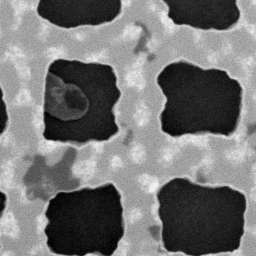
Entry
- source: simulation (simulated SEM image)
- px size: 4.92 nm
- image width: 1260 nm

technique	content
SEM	holes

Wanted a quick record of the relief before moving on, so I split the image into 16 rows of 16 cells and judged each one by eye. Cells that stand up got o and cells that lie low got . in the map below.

oo......oo.....o
ooo...ooooo....o
oooooooooooooooo
oooooooooooooooo
ooo....ooo....oo
ooo....ooo.....o
ooo....ooo.....o
ooo....ooo.....o
ooo....ooooooooo
oooooooooooooooo
oooooooooooooooo
oooooooooo..oooo
ooo.....oo.....o
ooo.....oo.....o
ooo.....oo.....o
ooo....ooo.....o